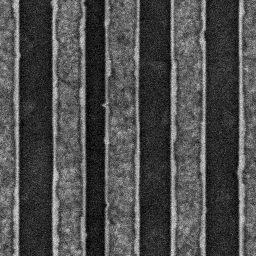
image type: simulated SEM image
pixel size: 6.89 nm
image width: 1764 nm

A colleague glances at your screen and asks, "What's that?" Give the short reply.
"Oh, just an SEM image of one or a few lines or trenches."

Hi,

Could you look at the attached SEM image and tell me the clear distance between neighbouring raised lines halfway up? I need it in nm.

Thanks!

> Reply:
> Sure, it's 243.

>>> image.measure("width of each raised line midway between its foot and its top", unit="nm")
213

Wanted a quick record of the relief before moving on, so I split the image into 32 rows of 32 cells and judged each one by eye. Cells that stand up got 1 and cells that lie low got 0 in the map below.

11000001110001111000001110000011
11000001110001111000001110000011
11000001110001111000001110000011
11000001110001111000001110000011
11000001110001111000001110000011
11000001110001111000001110000011
11000001110001111000001110000011
11000001110001111000001110000011
11000001110001111000001110000011
11000001110001111000001110000011
11000001110001111000001110000011
11000001110001111000001110000011
11000001110001111000001110000011
11000001110001111000001110000011
11000001110001111000001110000011
11000001110001111000001110000011
11000001110001111000001110000011
11000001110001111000001110000011
11000001110001111000001110000011
11000001110001111000001110000011
11000001110001111000001110000011
11000001110001111000001110000011
11000001111001111000001110000011
11000001110001111000001110000011
11000001110001111000001110000011
11000001110001111000001111000011
11000001110001111000001111000011
11000001110001111000001110000011
11000001110001111000001110000011
11000001111001111000001110000011
11000001110001111000001110000011
11000001110001111000001110000011